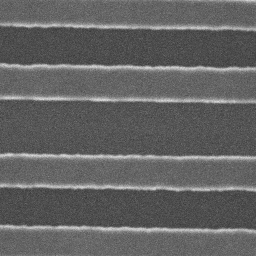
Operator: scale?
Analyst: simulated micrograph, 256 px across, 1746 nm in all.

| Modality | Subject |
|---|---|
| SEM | lines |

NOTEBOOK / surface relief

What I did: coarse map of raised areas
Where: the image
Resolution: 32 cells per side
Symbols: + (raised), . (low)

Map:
++++++++++++++++++++++++++++++++
++++++++++++++++++++++++++++++++
++++++++++++++++++++++++++++++++
..................++++++++++++++
................................
................................
................................
................................
+++++++++++++++++++++++++++.++++
++++++++++++++++++++++++++++++++
++++++++++++++++++++++++++++++++
++++++++++++++++++++++++++++++++
...........+++++++++++++++++++++
................................
................................
................................
................................
................................
................................
++++++++++++++++++++............
++++++++++++++++++++++++++++++++
++++++++++++++++++++++++++++++++
++++++++++++++++++++++++++++++++
.........++.+.++++++++++++++++++
................................
................................
................................
................................
++++++++++++++.+................
++++++++++++++++++++++++++++++++
++++++++++++++++++++++++++++++++
++++++++++++++++++++++++++++++++